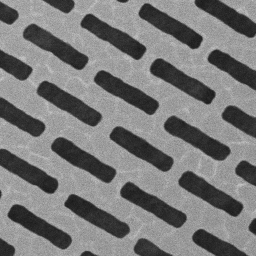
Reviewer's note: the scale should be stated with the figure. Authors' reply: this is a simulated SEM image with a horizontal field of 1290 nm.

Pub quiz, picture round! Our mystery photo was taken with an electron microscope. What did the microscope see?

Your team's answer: a regular array of holes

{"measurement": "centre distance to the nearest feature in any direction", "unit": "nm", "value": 287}